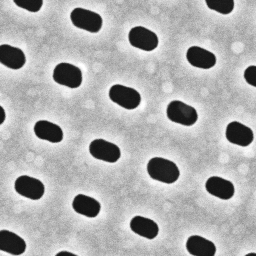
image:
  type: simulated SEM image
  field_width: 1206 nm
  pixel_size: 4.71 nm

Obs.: a regular array of holes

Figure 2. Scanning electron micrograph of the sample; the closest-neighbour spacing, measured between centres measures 275 nm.